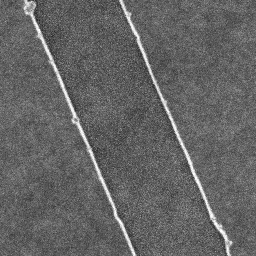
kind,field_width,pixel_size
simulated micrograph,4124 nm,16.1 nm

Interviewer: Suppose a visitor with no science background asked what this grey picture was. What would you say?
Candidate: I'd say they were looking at one or a few lines or trenches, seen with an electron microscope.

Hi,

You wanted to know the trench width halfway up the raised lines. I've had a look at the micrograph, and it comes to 1400 nanometers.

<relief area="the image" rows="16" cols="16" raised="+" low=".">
++......++++++++
++......++++++++
+++......+++++++
+++......+++++++
++++.....+++++++
++++......++++++
++++......++++++
+++++......+++++
+++++......+++++
++++++......++++
++++++......++++
++++++......++++
+++++++......+++
+++++++......+++
++++++++......++
++++++++......++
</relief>